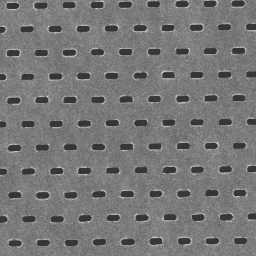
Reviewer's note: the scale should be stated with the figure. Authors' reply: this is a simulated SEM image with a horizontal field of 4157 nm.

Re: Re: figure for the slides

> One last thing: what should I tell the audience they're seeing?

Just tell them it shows a regular array of holes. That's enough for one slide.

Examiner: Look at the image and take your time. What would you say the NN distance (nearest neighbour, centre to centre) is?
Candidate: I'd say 0.442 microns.